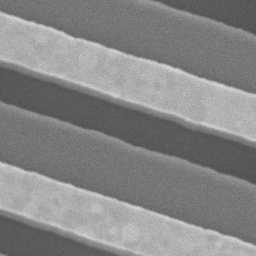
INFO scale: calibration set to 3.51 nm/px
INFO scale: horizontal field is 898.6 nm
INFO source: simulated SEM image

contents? lines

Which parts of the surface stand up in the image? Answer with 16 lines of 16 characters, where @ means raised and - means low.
@@@@@@@@@@@-----
@@@@@@@@@@@@@@--
@@@@@@@@@@@@@@@@
@@@@@@@@@@@@@@@@
--@@@@@@@@@@@@@@
-----@@@@@@@@@@@
--------@@@@@@@@
@@@@-------@@@@@
@@@@@@@--------@
@@@@@@@@@@------
@@@@@@@@@@@@@---
@@@@@@@@@@@@@@@@
@@@@@@@@@@@@@@@@
-@@@@@@@@@@@@@@@
----@@@@@@@@@@@@
-------@@@@@@@@@